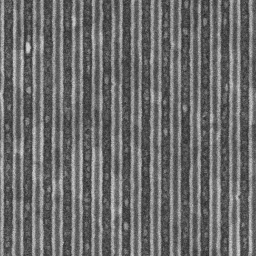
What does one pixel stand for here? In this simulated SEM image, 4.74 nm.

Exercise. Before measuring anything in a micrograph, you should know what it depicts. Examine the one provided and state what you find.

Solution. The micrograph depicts parallel lines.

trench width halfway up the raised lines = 11.1 px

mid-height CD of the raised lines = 40.3 nm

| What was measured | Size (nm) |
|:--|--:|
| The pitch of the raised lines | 93.3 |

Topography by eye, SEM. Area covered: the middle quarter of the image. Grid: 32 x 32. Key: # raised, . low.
..##...##...##...##...##...##...
..##...##...##...##...##...##...
..##...##...##...##...##...##...
...#...##...##...##...##...##...
..##...##...##...##...##...##...
...#...##...##...##...##...##...
..##...##...##...##...##...##...
..##...##...##...##...##...##...
..##...##...##...##...##...##...
..##...##...##...##...##...##...
..##...##...##...##...##...##...
...#...##...##...##...##...##...
...#...##...##...##...##...##...
..##...##...##...##...##...##...
..##...##...##...##...##...##...
..##...##...##...##...##...##...
..##...##...##...##...##...##...
..##...##...##...##...##...##...
...#...##...##...##...##...##...
...#...##...##...##...##...##...
...#...##...##...##...##...##...
..##...##...##...##...##...##...
..##...##...##...##...##...##...
..##...##...##...##...##...##...
..##...##...##...##...##...##...
..##...##...##...##...##...##...
..##...##...##...##...##...##...
...#...##...##...##...##...##...
..##...##...##...##...##...##...
..##...##...##...##...##...##...
..##...##...##...##...##...##...
..##...##...##...##...##...##...